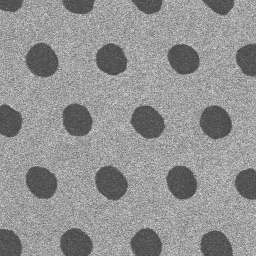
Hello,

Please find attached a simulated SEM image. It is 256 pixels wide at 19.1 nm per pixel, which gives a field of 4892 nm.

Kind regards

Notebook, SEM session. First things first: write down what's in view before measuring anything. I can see a regular array of holes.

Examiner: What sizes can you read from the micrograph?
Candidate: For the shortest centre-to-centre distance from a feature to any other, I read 1.32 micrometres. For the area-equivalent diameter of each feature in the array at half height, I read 610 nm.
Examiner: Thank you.